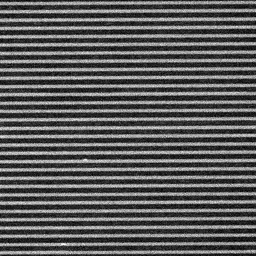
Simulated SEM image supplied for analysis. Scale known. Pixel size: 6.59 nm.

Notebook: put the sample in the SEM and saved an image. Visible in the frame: parallel lines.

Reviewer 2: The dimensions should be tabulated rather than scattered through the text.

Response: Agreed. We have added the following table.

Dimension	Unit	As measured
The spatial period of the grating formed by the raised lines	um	0.0548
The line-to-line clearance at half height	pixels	5.99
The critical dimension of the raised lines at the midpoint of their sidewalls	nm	17.3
